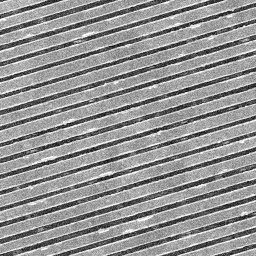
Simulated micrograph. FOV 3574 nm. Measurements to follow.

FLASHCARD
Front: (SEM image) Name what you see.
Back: parallel lines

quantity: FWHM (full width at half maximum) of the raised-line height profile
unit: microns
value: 0.142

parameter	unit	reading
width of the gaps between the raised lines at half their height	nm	75.3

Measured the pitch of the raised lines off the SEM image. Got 0.215 micrometres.